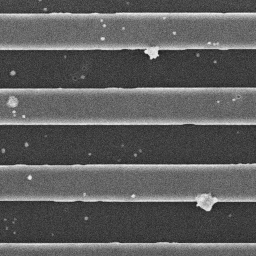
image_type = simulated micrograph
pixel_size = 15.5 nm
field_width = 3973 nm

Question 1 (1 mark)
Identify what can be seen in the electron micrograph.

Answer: lines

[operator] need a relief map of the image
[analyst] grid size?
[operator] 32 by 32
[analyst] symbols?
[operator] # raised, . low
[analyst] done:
................................
................................
################################
################################
################################
################################
..................##............
................................
................................
................................
................................
################################
################################
################################
################################
######################..########
................................
................................
................................
................................
................................
################################
################################
################################
################################
.........................##.....
................................
................................
................................
................................
################################
################################